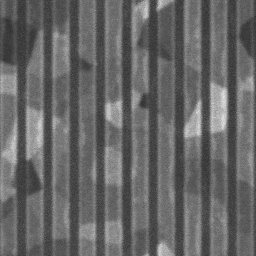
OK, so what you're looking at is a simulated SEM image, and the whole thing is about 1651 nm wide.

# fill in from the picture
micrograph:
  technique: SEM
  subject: parallel lines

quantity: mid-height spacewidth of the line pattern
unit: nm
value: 76.5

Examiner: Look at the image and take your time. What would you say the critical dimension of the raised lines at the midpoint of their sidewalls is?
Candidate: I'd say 95.9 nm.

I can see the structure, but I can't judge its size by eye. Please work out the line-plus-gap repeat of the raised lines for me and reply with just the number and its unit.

169 nm